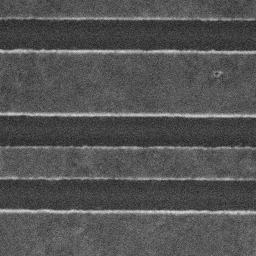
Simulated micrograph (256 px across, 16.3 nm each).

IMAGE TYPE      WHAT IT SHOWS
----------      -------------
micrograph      lines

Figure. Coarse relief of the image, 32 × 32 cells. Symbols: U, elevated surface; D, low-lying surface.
UUUUUUUUUUUUUUUUUUUUUUUUUUUUUUUU
UUUUUUUUUUUUUUUUUUUUUUUUUUUUUUUU
DDDDDDDDDDDDDDDDDDDDDDDDDDDDDDDD
DDDDDDDDDDDDDDDDDDDDDDDDDDDDDDDD
DDDDDDDDDDDDDDDDDDDDDDDDDDDDDDDD
DDDDDDDDDDDDDDDDDDDDDDDDDDDDDDDD
UUUUUUUUUUUUUUUUUUUUUUUUUUUUUUUU
UUUUUUUUUUUUUUUUUUUUUUUUUUUUUUUU
UUUUUUUUUUUUUUUUUUUUUUUUUUUUUUUU
UUUUUUUUUUUUUUUUUUUUUUUUUUUUUUUU
UUUUUUUUUUUUUUUUUUUUUUUUUUUUUUUU
UUUUUUUUUUUUUUUUUUUUUUUUUUUUUUUU
UUUUUUUUUUUUUUUUUUUUUUUUUUUUUUUU
UUUUUUUUUUUUUUUUUUUUUUUUUUUUUUUU
DDDDDDDDDDDDDDDDDDDDDDDUDDUUUUUU
DDDDDDDDDDDDDDDDDDDDDDDDDDDDDDDD
DDDDDDDDDDDDDDDDDDDDDDDDDDDDDDDD
DDDDDDDDDDDDDDDDDDDDDDDDDDDDDDDD
UUUUUUUUUUUUUUUUUUUUUUUUUDDUUDUU
UUUUUUUUUUUUUUUUUUUUUUUUUUUUUUUU
UUUUUUUUUUUUUUUUUUUUUUUUUUUUUUUU
UUUUUUUUUUUUUUUUUUUUUUUUUUUUUUUU
DDDDDDDDDDDDDDDDDDDDDDDDDDDDDDDD
DDDDDDDDDDDDDDDDDDDDDDDDDDDDDDDD
DDDDDDDDDDDDDDDDDDDDDDDDDDDDDDDD
DDDDDDDDDDDDDDDDDDDDDDDDDDDDDDDD
UUUUUUUUUUUUUUUUUUUUUUDDDDDDDDDD
UUUUUUUUUUUUUUUUUUUUUUUUUUUUUUUU
UUUUUUUUUUUUUUUUUUUUUUUUUUUUUUUU
UUUUUUUUUUUUUUUUUUUUUUUUUUUUUUUU
UUUUUUUUUUUUUUUUUUUUUUUUUUUUUUUU
UUUUUUUUUUUUUUUUUUUUUUUUUUUUUUUU